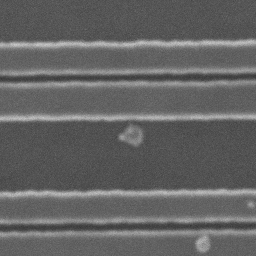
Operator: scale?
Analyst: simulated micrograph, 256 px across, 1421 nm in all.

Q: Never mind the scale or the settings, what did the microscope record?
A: lines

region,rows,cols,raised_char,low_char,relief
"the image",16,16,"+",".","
................
................
................
++++++++++++++++
++++++++++++++++
++++++++++++++++
++++++++++++++++
................
................
................
................
................
++++++++++++++++
++++++++++++++++
++++++++++++++++
++++++++++++++++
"